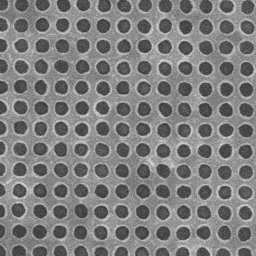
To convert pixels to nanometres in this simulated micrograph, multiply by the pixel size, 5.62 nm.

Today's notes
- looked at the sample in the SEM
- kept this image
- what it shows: a regular array of holes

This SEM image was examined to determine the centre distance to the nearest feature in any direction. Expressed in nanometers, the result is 113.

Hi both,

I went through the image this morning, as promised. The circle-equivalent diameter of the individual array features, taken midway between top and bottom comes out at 82.2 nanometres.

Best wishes